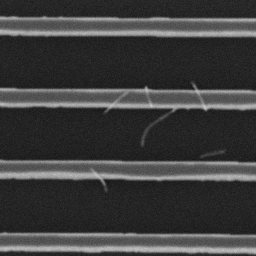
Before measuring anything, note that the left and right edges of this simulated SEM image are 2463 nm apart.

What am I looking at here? lines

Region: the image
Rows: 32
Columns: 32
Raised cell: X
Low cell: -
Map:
--------------------------------
--------------------------------
XXXXXXXXXXXXXXXXXXXXXXXXXXXXXXXX
XXXXXXXXXXXXXXXXXXXXXXXXXXXXXXXX
--------------------------------
--------------------------------
--------------------------------
--------------------------------
--------------------------------
--------------------------------
--------------------------------
XXXXXXXXXXXXXXXXXXXXXXXXXXXXXXXX
XXXXXXXXXXXXXXXXXXXXXXXXXXXXXXXX
-------------------------X------
--------------------------------
--------------------------------
--------------------------------
--------------------------------
--------------------------------
--------------------------------
XXXXXXXXXXXXXXXXXXXXXXXXXXXXXXXX
XXXXXXXXXXXXXXXXXXXXXXXXXXXXXXXX
--------------------------------
--------------------------------
--------------------------------
--------------------------------
--------------------------------
--------------------------------
--------------------------------
XXXXXXXXXXXXXXXXXXXXXXXXXXXXXXXX
XXXXXXXXXXXXXXXXXXXXXXXXXXXXXXXX
--------------------------------